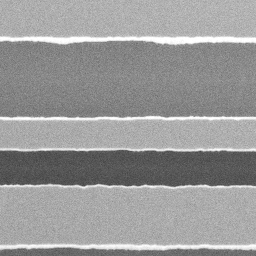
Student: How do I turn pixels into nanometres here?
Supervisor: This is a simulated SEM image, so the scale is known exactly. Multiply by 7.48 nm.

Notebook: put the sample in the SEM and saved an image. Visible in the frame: lines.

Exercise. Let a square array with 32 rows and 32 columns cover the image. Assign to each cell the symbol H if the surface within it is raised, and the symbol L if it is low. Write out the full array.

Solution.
HHHHHHHHHHHHHHHHHHHHHHHHHHHHHHHH
HHHHHHHHHHHHHHHHHHHHHHHHHHHHHHHH
HHHHHHHHHHHHHHHHHHHHHHHHHHHHHHHH
HHHHHHHHHHHHHHHHHHHHHHHHHHHHHHHH
HHHHHHHHHHHHHHHHHHHHHHHHHHHHHHHH
LLLLLLLLLLLLLLLLLLLLLLLLLLLLLLLL
LLLLLLLLLLLLLLLLLLLLLLLLLLLLLLLL
LLLLLLLLLLLLLLLLLLLLLLLLLLLLLLLL
LLLLLLLLLLLLLLLLLLLLLLLLLLLLLLLL
LLLLLLLLLLLLLLLLLLLLLLLLLLLLLLLL
LLLLLLLLLLLLLLLLLLLLLLLLLLLLLLLL
LLLLLLLLLLLLLLLLLLLLLLLLLLLLLLLL
LLLLLLLLLLLLLLLLLLLLLLLLLLLLLLLL
LLLLLLLLLLLLLLLLLLLLLLLLLLLLLLLL
LLLLLLLLLLLLLLLLLLLLLLLLLLLLLLLL
HHHHHHHHHHHHHHHHHHHHHHHHHHHHHHHH
HHHHHHHHHHHHHHHHHHHHHHHHHHHHHHHH
HHHHHHHHHHHHHHHHHHHHHHHHHHHHHHHH
HHHHHHHHHHHHHHHHHHHHHHHHHHHHHHHH
LLLLLLLLLLLLLLLLLLLLLLLLLLLLLLLL
LLLLLLLLLLLLLLLLLLLLLLLLLLLLLLLL
LLLLLLLLLLLLLLLLLLLLLLLLLLLLLLLL
LLLLLLLLLLLLLLLLLLLLLLLLLLLLLLLL
HHHHHHHHHHHHHHHHHHHHHHHHHHHHHHHH
HHHHHHHHHHHHHHHHHHHHHHHHHHHHHHHH
HHHHHHHHHHHHHHHHHHHHHHHHHHHHHHHH
HHHHHHHHHHHHHHHHHHHHHHHHHHHHHHHH
HHHHHHHHHHHHHHHHHHHHHHHHHHHHHHHH
HHHHHHHHHHHHHHHHHHHHHHHHHHHHHHHH
HHHHHHHHHHHHHHHHHHHHHHHHHHHHHHHH
HHHHHHHHHHHHHHHHHHHHHHHHHHHHHHHH
LLLLLLLLLLLLLLLLLLLLLLLLLLLLLLLL